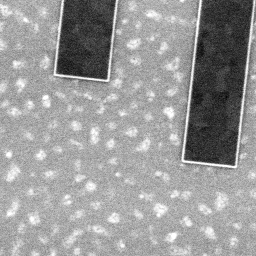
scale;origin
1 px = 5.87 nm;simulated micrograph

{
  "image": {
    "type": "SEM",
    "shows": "one or a few lines or trenches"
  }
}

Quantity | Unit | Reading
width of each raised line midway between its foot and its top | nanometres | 315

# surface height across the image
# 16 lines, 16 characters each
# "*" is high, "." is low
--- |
....***.....****
....***.....****
....***.....****
....***.....****
....***.....***.
............***.
............***.
............***.
............***.
...........****.
................
................
................
................
................
................